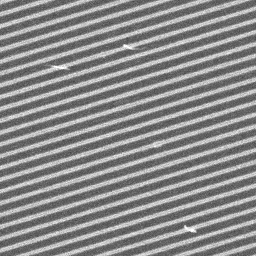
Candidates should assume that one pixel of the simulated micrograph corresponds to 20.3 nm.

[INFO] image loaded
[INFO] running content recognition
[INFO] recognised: parallel lines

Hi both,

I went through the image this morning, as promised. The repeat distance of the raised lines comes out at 230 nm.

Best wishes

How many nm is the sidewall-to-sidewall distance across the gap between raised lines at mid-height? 160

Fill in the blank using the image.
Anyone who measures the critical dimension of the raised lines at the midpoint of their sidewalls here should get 72.9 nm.